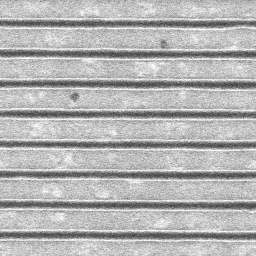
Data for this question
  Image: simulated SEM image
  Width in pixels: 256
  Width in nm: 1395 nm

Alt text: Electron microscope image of parallel lines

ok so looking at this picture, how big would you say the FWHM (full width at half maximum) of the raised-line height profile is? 10.4 pixels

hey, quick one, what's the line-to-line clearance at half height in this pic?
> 0.107 µm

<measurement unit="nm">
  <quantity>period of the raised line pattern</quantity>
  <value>165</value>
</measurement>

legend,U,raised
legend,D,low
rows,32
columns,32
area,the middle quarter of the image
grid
DDDDDDDDDDDDDDDDDDDDDDDDDDDDDDDD
DDDDDDDDDDDDDDDDDDDDDDDDDDDDDDDD
DDDDDDDDDDDDDDDDDDDDDDDDDDDDDDDD
DDDDDDDDDDDDDDDDDDDDDDDDDDDDDDDD
UUUUUUUUUUUUUUUUUUUUUUUUUUUUUUUU
UUUUUUUUUUUUUUUUUUUUUUUUUUUUUUUU
DDDDDDDDDDDDDDDDDDDDDDDDDDDDDDDD
DDDDDDDDDDDDDDDDDDDDDDDDDDDDDDDD
DDDDDDDDDDDDDDDDDDDDDDDDDDDDDDDD
DDDDDDDDDDDDDDDDDDDDDDDDDDDDDDDD
DDDDDDDDDDDDDDDDDDDDDDDDDDDDDDDD
UUUUUUUUUUDDDDDDUUUUUUUUUUUUUUUU
UUUUUUUUUUUUUUUUUUUUUUUUUUUUUUUU
UUUUUUUUUUUUUUUUUUUUUUUUUUUUUUUU
DDDDDDDDDDDDDDDDDDDDDDDDDDDDDDDD
DDDDDDDDDDDDDDDDDDDDDDDDDDDDDDDD
DDDDDDDDDDDDDDDDDDDDDDDDDDDDDDDD
DDDDDDDDDDDDDDDDDDDDDDDDDDDDDDDD
DDDDDDDDDDDDDDDDDDDDDDDDDDDDDDDD
UUUUUUUUUUUUUUUUUUUUUUUUUUUUUUUU
UUUUUUUUUUUUUUUUUUUUUUUUUUUUUUUU
DDDDDUUUDDDDDDDDDDDDDDDDDDDDDDDD
DDDDDDDDDDDDDDDDDDDDDDDDDDDDDDDD
DDDDDDDDDDDDDDDDDDDDDDDDDDDDDDDD
DDDDDDDDDDDDDDDDDDDDDDDDDDDDDDDD
DDDDDDDDDDDDDDDDDDDDDDDDDDDDDDDD
UUUUUUUUUUUUUUDDDDDDDDDDDDDDDDDD
UUUUUUUUUUUUUUUUUUUUUUUUUUUUUUUU
UUUUUUUUUUUUUUUUUUUUUUUUUUUUUUUU
DDDDDDDDDDDDDDDDDDDDDDDDDDDDDDDD
DDDDDDDDDDDDDDDDDDDDDDDDDDDDDDDD
DDDDDDDDDDDDDDDDDDDDDDDDDDDDDDDD